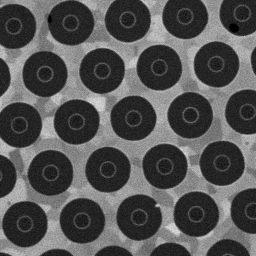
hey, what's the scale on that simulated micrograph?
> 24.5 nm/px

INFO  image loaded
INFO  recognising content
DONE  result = an array of small figures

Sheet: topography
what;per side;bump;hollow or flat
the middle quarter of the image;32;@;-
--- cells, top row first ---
-@@@----@@@----@@@----@@@@----@@
-@@@----@@@----@@@----@@@@----@@
-@@@----@@@----@@@-----@@-----@@
-@@@-----@-----@@@@----------@@@
-@@@-----------@@@@----------@@@
@@@@@---------@@@@@@--------@@@@
@@@@@@-------@@@@@@@@@----@@@@@@
@@@@@@@@---@@@@@@@@@@@@@@@@@@---
@@@@@@@@@@@@@@@-----@@@@@@@@----
------@@@@@@@--------@@@@@@-----
--------@@@@----------@@@@------
--------@@@@-----------@@@----@@
---------@@@----@@@----@@@----@@
-@@@@----@@----@@@@----@@@----@@
-@@@@----@@@----@@@----@@@-----@
--@@@----@@@-----------@@@------
---------@@@----------@@@@@-----
--------@@@@@---------@@@@@@----
-------@@@@@@@------@@@@@@@@@@--
------@@@@@@@@@@@@@@@@@@@@@@@@@@
@@@@@@@@@@@@@@@@@@@@@@------@@@@
@@@@@@@@------@@@@@@@--------@@@
@@@@@@@--------@@@@@----------@@
-@@@@@----------@@@@-----------@
--@@@@-----------@@-----@@@----@
--@@@----@@@@----@@----@@@@----@
--@@@----@@@@----@@@----@@@----@
---@@----@@@-----@@@-----------@
--@@@@----------@@@@----------@@
--@@@@----------@@@@@---------@@
--@@@@@--------@@@@@@@------@@@@
-@@@@@@@------@@@@@@@@@@@@@@@@@@